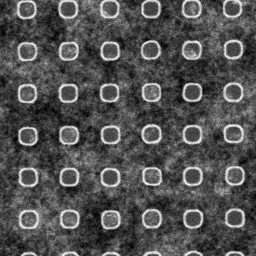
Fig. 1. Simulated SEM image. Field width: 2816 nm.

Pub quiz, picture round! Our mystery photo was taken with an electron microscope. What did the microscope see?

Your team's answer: a regular array of raised bodies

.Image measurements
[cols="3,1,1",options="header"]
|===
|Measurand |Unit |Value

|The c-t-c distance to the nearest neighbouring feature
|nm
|451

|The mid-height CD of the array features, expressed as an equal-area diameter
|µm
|0.203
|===